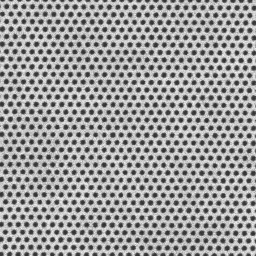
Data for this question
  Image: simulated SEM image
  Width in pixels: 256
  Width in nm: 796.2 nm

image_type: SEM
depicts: a regular array of holes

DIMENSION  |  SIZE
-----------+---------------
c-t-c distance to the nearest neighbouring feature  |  25.6 nm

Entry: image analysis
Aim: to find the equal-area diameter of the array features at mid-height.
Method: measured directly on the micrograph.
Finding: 15.7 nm